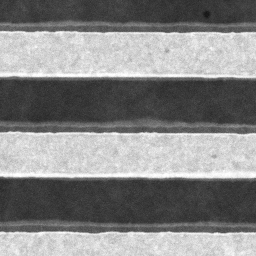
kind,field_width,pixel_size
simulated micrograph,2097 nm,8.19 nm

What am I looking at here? lines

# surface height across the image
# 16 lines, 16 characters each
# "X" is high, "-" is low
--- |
----------------
----------------
XXXXXXXXXXXXXXXX
XXXXXXXXXXXXXXXX
XXXXXXXXXXXXXXXX
----------------
----------------
----------------
XXXXXXXXXXXXXXXX
XXXXXXXXXXXXXXXX
XXXXXXXXXXXXXXXX
----------------
----------------
----------------
XXXXXXXXXXXXXXXX
XXXXXXXXXXXXXXXX